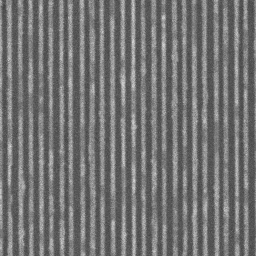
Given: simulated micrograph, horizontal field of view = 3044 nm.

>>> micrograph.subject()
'parallel lines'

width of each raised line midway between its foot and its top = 37.2 nm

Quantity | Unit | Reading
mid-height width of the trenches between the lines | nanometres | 84.7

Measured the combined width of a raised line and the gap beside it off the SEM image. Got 122 nanometres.